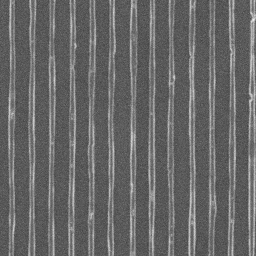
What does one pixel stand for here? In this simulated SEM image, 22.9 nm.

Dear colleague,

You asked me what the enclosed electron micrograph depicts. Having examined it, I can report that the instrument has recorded parallel lines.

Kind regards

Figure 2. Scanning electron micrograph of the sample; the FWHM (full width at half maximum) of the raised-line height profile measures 4.37 px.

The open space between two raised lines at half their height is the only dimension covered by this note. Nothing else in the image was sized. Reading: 0.351 um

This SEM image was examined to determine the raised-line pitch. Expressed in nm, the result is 458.